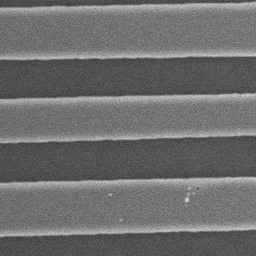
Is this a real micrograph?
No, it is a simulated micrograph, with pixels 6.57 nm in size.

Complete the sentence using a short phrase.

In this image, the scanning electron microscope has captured lines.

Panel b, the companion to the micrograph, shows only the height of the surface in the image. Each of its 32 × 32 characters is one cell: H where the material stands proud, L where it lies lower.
LLLLLLLLLLLLLLLLLLLLLLLHHHHHHHHH
HHHHHHHHHHHHHHHHHHHHHHHHHHHHHHHH
HHHHHHHHHHHHHHHHHHHHHHHHHHHHHHHH
HHHHHHHHHHHHHHHHHHHHHHHHHHHHHHHH
HHHHHHHHHHHHHHHHHHHHHHHHHHHHHHHH
HHHHHHHHHHHHHHHHHHHHHHHHHHHHHHHH
HHHHHHHHHHHHHHHHHHHHHHHHHHHHHHHH
LLLLLLLLLLLLLLLLLLLLLLLLLLLLLLLL
LLLLLLLLLLLLLLLLLLLLLLLLLLLLLLLL
LLLLLLLLLLLLLLLLLLLLLLLLLLLLLLLL
LLLLLLLLLLLLLLLLLLLLLLLLLLLLLLLL
LLLLLLLLLLLLLLLLLLLLLLLLLLLLLLLL
HHHHHHHHHHHHHHHHHHHHHHHHHHHHHHHH
HHHHHHHHHHHHHHHHHHHHHHHHHHHHHHHH
HHHHHHHHHHHHHHHHHHHHHHHHHHHHHHHH
HHHHHHHHHHHHHHHHHHHHHHHHHHHHHHHH
HHHHHHHHHHHHHHHHHHHHHHHHHHHHHHHH
HHHHHHHHHHHHHLHLLLLLLLLLLLLLLLLL
LLLLLLLLLLLLLLLLLLLLLLLLLLLLLLLL
LLLLLLLLLLLLLLLLLLLLLLLLLLLLLLLL
LLLLLLLLLLLLLLLLLLLLLLLLLLLLLLLL
LLLLLLLLLLLLLLLLLLLLLLLLLLLLLLLL
LLLLLLLLLLLLLLLLLLLHHHHHHHHHHHHH
HHHHHHHHHHHHHHHHHHHHHHHHHHHHHHHH
HHHHHHHHHHHHHHHHHHHHHHHHHHHHHHHH
HHHHHHHHHHHHHHHHHHHHHHHHHHHHHHHH
HHHHHHHHHHHHHHHHHHHHHHHHHHHHHHHH
HHHHHHHHHHHHHHHHHHHHHHHHHHHHHHHH
HHHHHHHHHHHHHHHHHHHHHHHHHHHHHHHH
HLLLLLLLLLLLLLLLLLLLLLLLLLLLLLLL
LLLLLLLLLLLLLLLLLLLLLLLLLLLLLLLL
LLLLLLLLLLLLLLLLLLLLLLLLLLLLLLLL